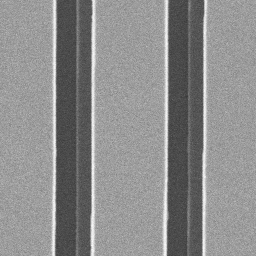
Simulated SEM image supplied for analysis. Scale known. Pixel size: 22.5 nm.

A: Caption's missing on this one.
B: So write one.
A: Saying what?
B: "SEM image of lines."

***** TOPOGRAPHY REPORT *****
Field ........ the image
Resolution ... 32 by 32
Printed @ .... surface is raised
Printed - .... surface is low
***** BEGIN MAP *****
@@@@@@@-----@@@@@@@@@-----@@@@@@
@@@@@@@-----@@@@@@@@@-----@@@@@@
@@@@@@@-----@@@@@@@@@-----@@@@@@
@@@@@@@-----@@@@@@@@@-----@@@@@@
@@@@@@@-----@@@@@@@@@-----@@@@@@
@@@@@@@-----@@@@@@@@@-----@@@@@@
@@@@@@@-----@@@@@@@@@-----@@@@@@
@@@@@@@-----@@@@@@@@@-----@@@@@@
@@@@@@@-----@@@@@@@@@-----@@@@@@
@@@@@@@-----@@@@@@@@@-----@@@@@@
@@@@@@@-----@@@@@@@@@-----@@@@@@
@@@@@@@-----@@@@@@@@@-----@@@@@@
@@@@@@@-----@@@@@@@@@-----@@@@@@
@@@@@@@-----@@@@@@@@@-----@@@@@@
@@@@@@@-----@@@@@@@@@-----@@@@@@
@@@@@@@-----@@@@@@@@@-----@@@@@@
@@@@@@@-----@@@@@@@@@-----@@@@@@
@@@@@@@-----@@@@@@@@@-----@@@@@@
@@@@@@@-----@@@@@@@@@-----@@@@@@
@@@@@@@-----@@@@@@@@@----@@@@@@@
@@@@@@@-----@@@@@@@@@----@@@@@@@
@@@@@@@-----@@@@@@@@@----@@@@@@@
@@@@@@@-----@@@@@@@@@----@@@@@@@
@@@@@@@-----@@@@@@@@@----@@@@@@@
@@@@@@@-----@@@@@@@@@----@@@@@@@
@@@@@@@-----@@@@@@@@@----@@@@@@@
@@@@@@@-----@@@@@@@@@----@@@@@@@
@@@@@@@----@@@@@@@@@@----@@@@@@@
@@@@@@@----@@@@@@@@@@----@@@@@@@
@@@@@@@----@@@@@@@@@@----@@@@@@@
@@@@@@@----@@@@@@@@@@----@@@@@@@
@@@@@@@----@@@@@@@@@@----@@@@@@@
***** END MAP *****